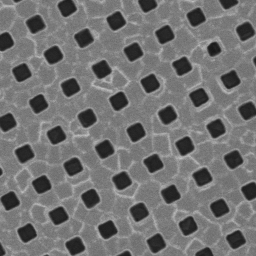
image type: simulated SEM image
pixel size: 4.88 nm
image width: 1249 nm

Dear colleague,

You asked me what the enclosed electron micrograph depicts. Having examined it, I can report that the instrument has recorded a regular array of holes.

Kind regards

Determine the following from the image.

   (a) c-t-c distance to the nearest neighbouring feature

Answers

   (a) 173 nanometers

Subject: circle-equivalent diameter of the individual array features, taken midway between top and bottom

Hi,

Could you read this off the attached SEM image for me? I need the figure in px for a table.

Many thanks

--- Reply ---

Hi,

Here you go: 18.4